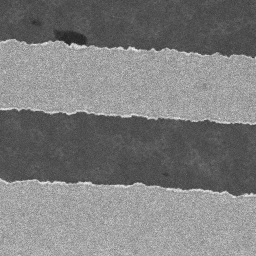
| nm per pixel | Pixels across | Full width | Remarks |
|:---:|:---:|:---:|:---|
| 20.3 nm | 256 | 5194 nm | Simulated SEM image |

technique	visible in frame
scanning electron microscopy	one or a few lines or trenches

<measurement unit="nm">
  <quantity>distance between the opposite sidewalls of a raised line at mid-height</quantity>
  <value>1350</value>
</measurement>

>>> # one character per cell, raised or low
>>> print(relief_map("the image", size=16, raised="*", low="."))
................
................
................
***************.
****************
****************
****************
............****
................
................
................
******..*.......
****************
****************
****************
****************